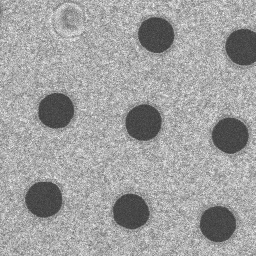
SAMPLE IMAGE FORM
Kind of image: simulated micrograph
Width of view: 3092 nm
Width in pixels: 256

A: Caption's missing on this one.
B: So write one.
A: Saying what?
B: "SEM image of holes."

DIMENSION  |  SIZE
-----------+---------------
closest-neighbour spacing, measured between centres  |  1.06 um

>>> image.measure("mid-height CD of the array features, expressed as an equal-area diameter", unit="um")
0.438